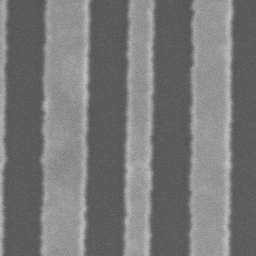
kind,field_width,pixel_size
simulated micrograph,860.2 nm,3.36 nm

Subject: lines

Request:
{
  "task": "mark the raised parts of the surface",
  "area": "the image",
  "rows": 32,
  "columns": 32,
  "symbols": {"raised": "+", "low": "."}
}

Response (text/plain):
+.....+++++.....+++.....+++++...
+.....+++++.....+++.....+++++...
+.....+++++.....+++.....+++++...
+.....+++++.....+++.....+++++...
+.....+++++.....+++.....+++++...
+.....+++++.....+++.....+++++...
+.....+++++.....+++.....+++++...
+.....+++++.....+++.....+++++...
......+++++.....+++.....+++++...
+.....+++++.....+++.....+++++...
+.....+++++.....+++.....+++++...
+.....+++++.....+++.....+++++...
+.....+++++.....+++.....+++++...
......+++++.....+++.....+++++...
......+++++.....+++.....+++++...
......+++++.....+++.....+++++...
.....++++++.....+++.....+++++...
......+++++.....+++.....+++++...
......+++++.....+++.....+++++...
+....++++++.....+++.....+++++...
.....++++++.....+++.....+++++...
......+++++.....+++.....+++++...
......+++++.....+++.....+++++...
......++++......+++.....+++++...
......++++......+++.....+++++...
.....++++++.....+++.....+++++...
.....+++++......+++.....+++++...
.....++++++.....++......++++....
.....+++++......+++.....++++....
.....+++++......+++.....++++....
.....+++++......+++.....++++....
.....+++++......+++.....++++....